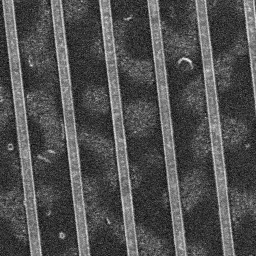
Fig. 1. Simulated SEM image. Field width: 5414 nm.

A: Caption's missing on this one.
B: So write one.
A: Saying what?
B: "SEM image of parallel lines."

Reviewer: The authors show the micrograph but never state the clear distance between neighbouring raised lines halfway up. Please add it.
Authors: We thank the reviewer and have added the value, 809 nanometers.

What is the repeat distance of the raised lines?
1010 nanometers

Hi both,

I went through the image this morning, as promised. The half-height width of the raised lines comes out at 186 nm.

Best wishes